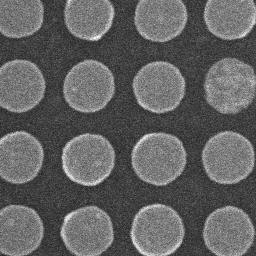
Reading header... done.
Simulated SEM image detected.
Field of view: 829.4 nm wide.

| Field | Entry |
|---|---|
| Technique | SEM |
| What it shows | raised bodies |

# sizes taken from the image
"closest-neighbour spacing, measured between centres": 228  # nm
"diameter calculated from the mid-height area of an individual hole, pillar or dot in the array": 168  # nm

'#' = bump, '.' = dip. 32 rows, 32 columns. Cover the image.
#####...######...######...######
#####...######...######...######
#####...######...######...######
#####....#####...######...#####.
.##.......###.....####.....###..
................................
................................
................................
#####....####.....####......#...
#####...######...######......#..
######..######...######.....#...
#####...######...######...#.#...
#####...######...######.....##..
.###.....####.....####......#...
................................
................................
................................
#####....####.....####....#####.
#####...######...######...######
#####...######...######..#######
#####...######...######..#######
#####...######...######...#####.
.###.....####.....####.....###..
................................
................................
................................
####.....####....#####.....###..
#####...######...######...#####.
#####...######...######...######
#####...######..#######..#######
#####...######...#####....#####.
####.....####.....####.....####.